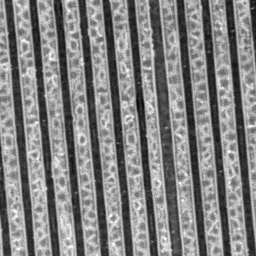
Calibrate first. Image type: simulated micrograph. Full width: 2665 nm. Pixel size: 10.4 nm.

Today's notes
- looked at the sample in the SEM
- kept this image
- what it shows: parallel lines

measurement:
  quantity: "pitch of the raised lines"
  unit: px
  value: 24.4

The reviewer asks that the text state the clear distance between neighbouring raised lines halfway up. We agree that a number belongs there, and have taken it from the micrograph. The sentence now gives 9.58 pixels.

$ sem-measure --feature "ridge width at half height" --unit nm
161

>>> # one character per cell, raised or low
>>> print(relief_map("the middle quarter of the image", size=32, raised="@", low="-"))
-@@@@--@@@@--@@@@--@@@----@@@---
-@@@@--@@@@--@@@@---@@----@@@---
-@@@@---@@@---@@@---@@----@@@---
-@@@@---@@@---@@@---@@----@@@@--
-@@@@---@@@---@@@---@@@---@@@@--
-@@@@---@@@---@@@---@@@---@@@@--
--@@@---@@@---@@@---@@@---@@@@--
--@@@---@@@---@@@@--@@@---@@@@--
--@@@---@@@@--@@@@--@@@----@@@--
--@@@@--@@@@--@@@@--@@@----@@@--
--@@@@--@@@@--@@@@--@@@----@@@--
--@@@@--@@@@--@@@@--@@@----@@@--
--@@@@--@@@@---@@@---@@----@@@--
--@@@@--@@@@---@@@---@@----@@@--
--@@@@--@@@@---@@@---@@----@@@@-
--@@@@--@@@@---@@@---@@@---@@@@-
---@@@---@@@---@@@@--@@@---@@@@-
---@@@---@@@---@@@@--@@@---@@@@-
---@@@---@@@---@@@@--@@@---@@@@-
---@@@---@@@@--@@@@--@@@---@@@@-
@--@@@---@@@@--@@@@--@@@---@@@@-
@--@@@@--@@@@--@@@@--@@@---@@@@-
@--@@@@--@@@@--@@@@--@@@----@@@-
@--@@@@--@@@@---@@@--@@@----@@@-
@--@@@@---@@@---@@@--@@@----@@@-
@--@@@@---@@@---@@@---@@----@@@@
@--@@@@---@@@---@@@---@@@---@@@@
@---@@@---@@@---@@@---@@@---@@@@
@---@@@---@@@---@@@---@@@---@@@@
@---@@@---@@@---@@@@--@@@---@@@@
@---@@@---@@@@--@@@@--@@@---@@@@
@---@@@@--@@@@--@@@@--@@@---@@@@